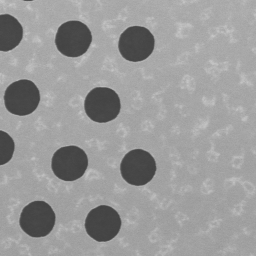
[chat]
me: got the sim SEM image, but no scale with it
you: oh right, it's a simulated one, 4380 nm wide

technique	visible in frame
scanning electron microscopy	a regular array of holes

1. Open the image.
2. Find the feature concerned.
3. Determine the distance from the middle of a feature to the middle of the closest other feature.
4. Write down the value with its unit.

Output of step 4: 1110 nanometers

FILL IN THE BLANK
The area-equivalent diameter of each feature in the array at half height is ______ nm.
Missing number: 622